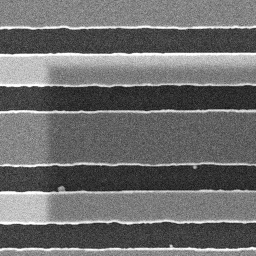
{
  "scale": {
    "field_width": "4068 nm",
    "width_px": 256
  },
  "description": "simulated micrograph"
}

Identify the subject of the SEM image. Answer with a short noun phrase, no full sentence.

lines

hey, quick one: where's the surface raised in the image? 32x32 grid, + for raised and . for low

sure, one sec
++++++++++++++++++++++++++++++++
++++++++++++++++++++++++++++++++
++++++++++++++++++++++++++++++++
+...+...........................
................................
................................
................................
++++++++++++++++++++++++++++++++
++++++++++++++++++++++++++++++++
++++++++++++++++++++++++++++++++
++++++++++++++++++++++++++++++++
................................
................................
................................
++++++++++++++++++++++++++++++++
++++++++++++++++++++++++++++++++
++++++++++++++++++++++++++++++++
++++++++++++++++++++++++++++++++
++++++++++++++++++++++++++++++++
++++++++++++++++++++++++++++++++
++++++++++.++++++++++++++..+++++
................................
................................
................................
++++++++++++++++++++++++++++++++
++++++++++++++++++++++++++++++++
++++++++++++++++++++++++++++++++
++++++++++++++++++++++++++++++++
................................
................................
................................
++++++++++++++++++++++++++++++++